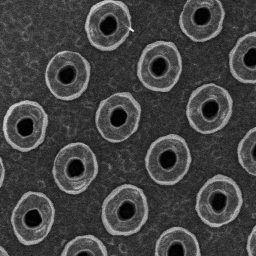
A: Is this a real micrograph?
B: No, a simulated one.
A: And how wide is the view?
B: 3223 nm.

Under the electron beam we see a regular array of ring-shaped raised bodies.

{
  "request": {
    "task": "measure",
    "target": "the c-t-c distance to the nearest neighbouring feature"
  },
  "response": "824 nanometers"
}